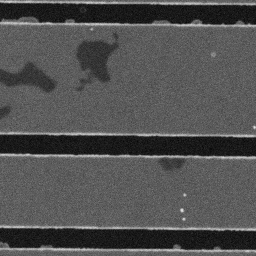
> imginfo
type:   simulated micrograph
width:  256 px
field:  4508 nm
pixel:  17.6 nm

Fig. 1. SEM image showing lines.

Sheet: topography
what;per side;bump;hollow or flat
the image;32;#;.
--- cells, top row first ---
...................#############
................................
................................
################################
################################
################################
################################
################################
################################
################################
################################
################################
################################
################################
################################
################################
################################
................................
................................
##############.##...............
################################
################################
################################
################################
################################
################################
################################
################################
.....#.#.#######################
................................
................................
################################